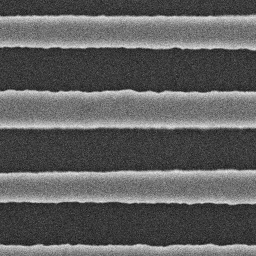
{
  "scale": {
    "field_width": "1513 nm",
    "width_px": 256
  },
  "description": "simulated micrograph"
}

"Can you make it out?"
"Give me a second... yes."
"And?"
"lines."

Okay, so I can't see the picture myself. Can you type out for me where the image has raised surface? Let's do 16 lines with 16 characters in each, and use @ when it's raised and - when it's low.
----------------
@@@@@@@@@@@@@@@@
@@@@@@@@@@@@@@@@
----------------
----------------
----------------
@@@@@@@@@@@@@@@@
@@@@@@@@@@@@@@@@
----------------
----------------
----------------
@@@@@@@@@@@@@@@@
@@@@@@@@@@@@@@@@
----------------
----------------
@@@@@@@@@@@@@@@@